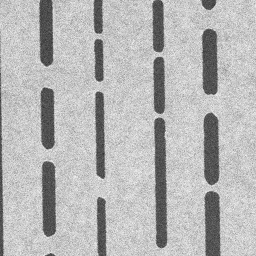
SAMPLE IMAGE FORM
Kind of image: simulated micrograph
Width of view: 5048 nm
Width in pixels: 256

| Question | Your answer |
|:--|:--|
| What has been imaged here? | parallel lines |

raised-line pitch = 1070 nm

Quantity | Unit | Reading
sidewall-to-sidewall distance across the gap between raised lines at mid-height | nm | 224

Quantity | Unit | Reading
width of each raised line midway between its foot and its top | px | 40.6